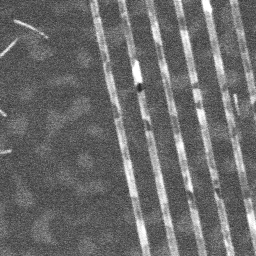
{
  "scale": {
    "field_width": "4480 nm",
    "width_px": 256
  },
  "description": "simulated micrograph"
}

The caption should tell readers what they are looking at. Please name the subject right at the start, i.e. parallel lines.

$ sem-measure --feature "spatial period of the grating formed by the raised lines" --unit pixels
27.5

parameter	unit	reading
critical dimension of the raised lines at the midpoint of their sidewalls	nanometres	103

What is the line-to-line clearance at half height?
21.5 px